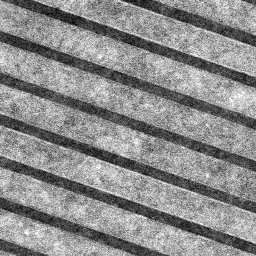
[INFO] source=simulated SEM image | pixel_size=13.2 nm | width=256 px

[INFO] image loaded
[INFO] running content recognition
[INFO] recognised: parallel lines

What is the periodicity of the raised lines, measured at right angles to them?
520 nanometers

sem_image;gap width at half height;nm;367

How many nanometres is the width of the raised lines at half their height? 154